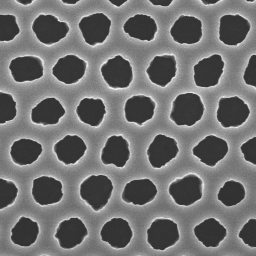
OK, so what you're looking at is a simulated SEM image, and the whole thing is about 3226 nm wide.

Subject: a regular array of holes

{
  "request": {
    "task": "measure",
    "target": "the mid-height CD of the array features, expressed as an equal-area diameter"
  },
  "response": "30 pixels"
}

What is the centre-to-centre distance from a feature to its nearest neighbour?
558 nm